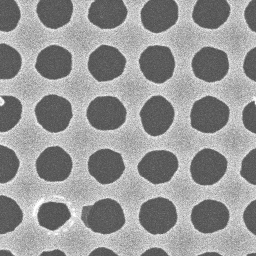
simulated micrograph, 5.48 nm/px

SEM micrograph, a regular array of holes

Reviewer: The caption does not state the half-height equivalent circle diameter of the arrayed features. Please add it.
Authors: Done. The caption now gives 0.204 um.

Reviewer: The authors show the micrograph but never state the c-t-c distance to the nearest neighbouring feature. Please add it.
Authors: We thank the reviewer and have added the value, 276 nm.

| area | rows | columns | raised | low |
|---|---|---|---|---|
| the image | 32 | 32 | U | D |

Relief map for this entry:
DDUUUDDDDUUDDDDDUUDDDDUUDDDDDUUD
DDDUUDDDDUUDDDDDUUDDDDUUDDDDDUUD
DDUUUDDDDUUDDDDDUUDDDDUUDDDDUUUD
DDUUUUDUUUUUDDUUUUDDDUUUUDDUUUUD
UUUUUUUUUUUUUUUUUUUUUUUUUUUUUUUU
DUUUUUUUUUUUUUUUUUUUUUUUUUUUUUUU
DDUUUDDDDUUUDDDUUUDDDUUUUDDDUUUD
DDDUDDDDDUUDDDDDUDDDDDUUDDDDDUDD
DDDUDDDDDUUDDDDDUUDDDDUUDDDDDUDD
DDUUUDDDUUUUDDDUUUDDDUUUDDDDUUUD
UUUUUUUUUUUUUUUUUUUUUUUUUUUUUUUU
UUUUUUUUUUUUUUUUUUUUUUUUUUUUUUUU
DDUUUDDDUUUUDDDUUUDDDUUUUDDDUUUU
DDDUDDDDDUUDDDDDUUDDDDUUDDDDDUUD
DDDUDDDDDUUDDDDDUDDDDDUUDDDDDUDD
DDUUUDDDDUUDDDDUUUDDDUUUDDDDUUDD
UUUUUUDUUUUUUUUUUUDDDUUUUDDUUUUD
UUUUUUUUUUUUUUUUUUUUUUUUUUUUUUUU
DUUUUUDDUUUUUUUUUUUUUUUUUUUUUUUU
DDUUUDDDDUUDDDDUUUDDDDUUDDDDUUUD
DDUUDDDDDUUDDDDDUDDDDDUUDDDDUUDD
DDUUUDDDDUUDDDDUUDDDDDUUDDDDUUDD
DUUUUUDDUUUUDDDUUUDDDUUUDDDUUUUD
UUUUUUUUUUUUUUUUUUUUUUUUUUUUUUUU
DUUUUUUUUUUUUUUUUUUUUUUUUUUUUUUU
DDUUUDDDUUUUDDDUUUDDDDUUUDDDUUUD
DDDUUDDDDUDDDDDUUDDDDDUUDDDDDUDD
DDDUUDDDUUDDDDDDUDDDDDUUDDDDDUDD
DDUUUUDUUUUDDDDUUUDDDUUUDDDDUUUD
UUUUUUUUUUUUUUUUUUUUUUUUUUUUUUUU
UUUUUUUUUUUUUUUUUUUUUUUUUUUUUUUU
DUUUUDDDUUUDDDUUUUDDDUUUUUDUUUUU